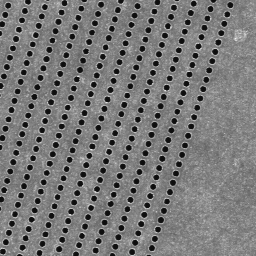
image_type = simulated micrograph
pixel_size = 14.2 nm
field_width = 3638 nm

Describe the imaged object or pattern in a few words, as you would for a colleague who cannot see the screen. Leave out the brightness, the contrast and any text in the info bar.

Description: a regular array of holes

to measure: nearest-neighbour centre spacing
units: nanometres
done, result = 138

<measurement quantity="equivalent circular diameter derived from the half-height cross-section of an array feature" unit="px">5.76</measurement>